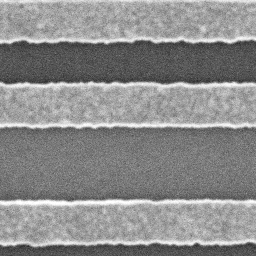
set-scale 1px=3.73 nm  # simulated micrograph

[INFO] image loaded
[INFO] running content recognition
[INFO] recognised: lines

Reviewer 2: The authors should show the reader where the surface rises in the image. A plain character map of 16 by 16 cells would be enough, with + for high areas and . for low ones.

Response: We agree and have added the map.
++++++++++++++++
++++++++++++++++
++++++++++++++++
................
................
++++++++++++++++
++++++++++++++++
++++++++++++++++
................
................
................
................
................
++++++++++++++++
++++++++++++++++
................